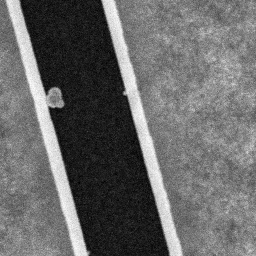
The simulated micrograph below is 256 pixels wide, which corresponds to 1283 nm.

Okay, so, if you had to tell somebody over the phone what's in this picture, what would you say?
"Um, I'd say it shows one or a few lines or trenches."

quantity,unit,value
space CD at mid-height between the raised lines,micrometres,0.456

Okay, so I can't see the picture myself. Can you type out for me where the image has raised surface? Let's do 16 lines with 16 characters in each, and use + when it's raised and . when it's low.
+......+++++++++
+......+++++++++
+......+++++++++
++......++++++++
++......++++++++
++......++++++++
+++.....++++++++
+++......+++++++
+++......+++++++
+++......+++++++
++++......++++++
++++......++++++
++++......++++++
++++......++++++
+++++......+++++
+++++......+++++